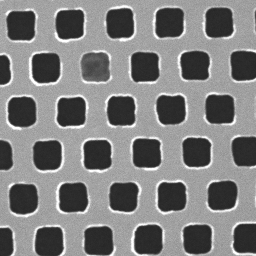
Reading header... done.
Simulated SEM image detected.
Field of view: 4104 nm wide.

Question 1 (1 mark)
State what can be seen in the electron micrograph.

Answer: a regular array of holes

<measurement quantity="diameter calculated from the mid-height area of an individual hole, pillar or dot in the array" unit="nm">505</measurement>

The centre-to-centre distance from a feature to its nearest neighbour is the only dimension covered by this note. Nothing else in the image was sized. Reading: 789 nm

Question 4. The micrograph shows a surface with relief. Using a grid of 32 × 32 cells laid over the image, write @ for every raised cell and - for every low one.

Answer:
@@@@@@@@@@@@@@@@@@@@@@@@@@@@@@@@
@---@@@---@@@@---@@@---@@@---@@@
@---@@@----@@----@@----@@@---@@@
@---@@@----@@----@@----@@@---@@@
@---@@@---@@@@--@@@@--@@@@---@@@
@@@@@@@@@@@@@@@@@@@@@@@@@@@@@@@@
@@@@@@@@@@@@-@@@@@@@@@@--@@@@--@
-@@@---@@@----@@----@@@---@@@---
-@@@----@@----@@----@@@---@@@---
-@@@---@@@----@@----@@@---@@@---
-@@@@-@@@@@@@@@@@@@@@@@@@@@@@@@@
@@@@@@@@@@@@@@@@@@@@@@@@@@@@@@@@
@---@@@---@@@@---@@@---@@@---@@@
@----@@----@@----@@----@@@---@@@
@----@@----@@----@@@---@@@---@@@
@---@@@---@@@@--@@@@--@@@@@-@@@@
@@@@@@@@@@@@@@@@@@@@@@@@@@@@@@@@
@@@@@@-@@@@@-@@@@--@@@@---@@@---
--@@----@@----@@@---@@@---@@@---
--@@----@@----@@@---@@@---@@@---
--@@----@@----@@@---@@@---@@@@--
@@@@@@@@@@@@@@@@@@@@@@@@@@@@@@@@
@@@@@@@@@@@@@@@@@@@@@@@@@@@@@@@@
@---@@@----@@@---@@@---@@@----@@
@----@@----@@@---@@@---@@@----@@
@----@@----@@@---@@@---@@@---@@@
@@--@@@@--@@@@@-@@@@@@@@@@@@@@@@
@@@@@@@@@@@@@@@@@@@@@@@@@@@@@@@@
-@@@@--@@@@---@@@---@@@---@@@---
--@@----@@@---@@@---@@@---@@@---
--@@----@@----@@@---@@@---@@@---
--@@----@@@---@@@---@@@---@@@@--